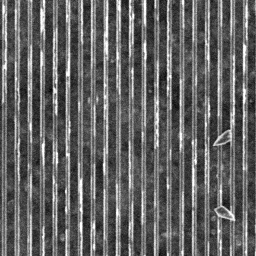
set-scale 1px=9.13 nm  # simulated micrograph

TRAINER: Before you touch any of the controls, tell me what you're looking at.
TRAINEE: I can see parallel lines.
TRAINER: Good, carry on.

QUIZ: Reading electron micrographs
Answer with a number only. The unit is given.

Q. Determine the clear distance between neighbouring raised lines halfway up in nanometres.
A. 81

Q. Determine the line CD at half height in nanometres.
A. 33.1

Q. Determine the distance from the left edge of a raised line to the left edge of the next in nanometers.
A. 116